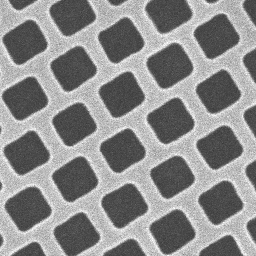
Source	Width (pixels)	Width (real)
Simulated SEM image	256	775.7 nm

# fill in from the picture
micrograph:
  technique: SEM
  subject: a regular array of holes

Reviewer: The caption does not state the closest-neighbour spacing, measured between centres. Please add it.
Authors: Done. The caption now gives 0.166 micrometres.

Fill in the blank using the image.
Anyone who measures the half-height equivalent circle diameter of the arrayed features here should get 126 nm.